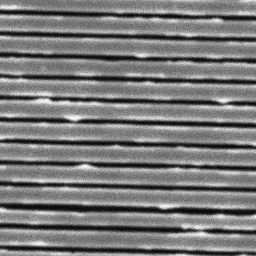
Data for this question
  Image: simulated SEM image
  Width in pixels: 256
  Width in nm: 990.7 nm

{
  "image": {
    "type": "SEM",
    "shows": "parallel lines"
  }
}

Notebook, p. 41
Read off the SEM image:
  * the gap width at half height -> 22.7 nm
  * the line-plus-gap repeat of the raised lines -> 0.0829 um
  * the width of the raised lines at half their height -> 61.4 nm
